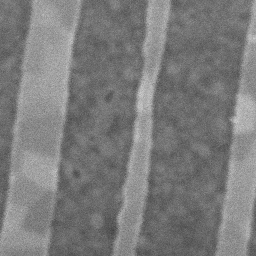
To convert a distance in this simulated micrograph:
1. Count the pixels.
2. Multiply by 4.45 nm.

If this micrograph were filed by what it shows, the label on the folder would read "one or a few lines or trenches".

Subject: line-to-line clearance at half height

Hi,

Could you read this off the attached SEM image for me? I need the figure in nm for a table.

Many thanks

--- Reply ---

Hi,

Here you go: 323